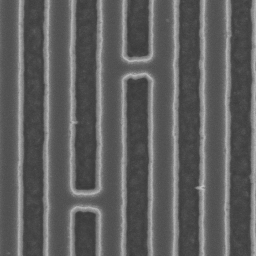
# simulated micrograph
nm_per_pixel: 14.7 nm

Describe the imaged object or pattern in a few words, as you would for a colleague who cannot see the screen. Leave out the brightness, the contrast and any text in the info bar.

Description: parallel lines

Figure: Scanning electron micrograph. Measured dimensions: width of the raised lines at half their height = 391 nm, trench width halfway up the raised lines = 362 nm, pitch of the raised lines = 761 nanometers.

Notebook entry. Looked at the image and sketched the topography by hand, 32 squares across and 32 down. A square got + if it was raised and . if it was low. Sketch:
+++...+++...++++...+++...++++...
+++...+++...++++...+++...++++...
+++...+++...++++...+++...++++...
+++...+++...++++...+++...++++...
+++...+++...++++...+++...++++...
+++...+++...++++...+++...++++...
+++...+++...++++...+++...++++...
+++...+++...++++++++++...++++...
+++...+++...++++++++++...++++...
+++...+++...++++++++++...++++...
+++...+++...++++...+++...++++...
+++...+++...++++...+++...++++...
+++...+++...++++...+++...++++...
+++...+++...++++...+++...++++...
+++...+++...++++...+++...++++...
+++...+++...++++...+++...++++...
+++...+++...++++...+++...+++....
+++...+++...++++...+++...+++....
+++...+++...++++...+++...++++...
+++...+++...++++...+++...+++....
+++...+++...++++...+++...+++....
+++...+++...++++...+++...+++....
+++...+++...++++...+++...+++....
+++...+++...++++...+++...+++....
+++...++++++++++...+++...+++....
+++...++++++++++...+++...+++....
+++...+++...++++...+++...+++....
+++...+++...++++...+++...+++....
+++...+++...++++...+++...+++....
+++...+++...++++...+++...+++....
+++...+++...++++...+++...+++....
+++...+++...++++...+++...+++....